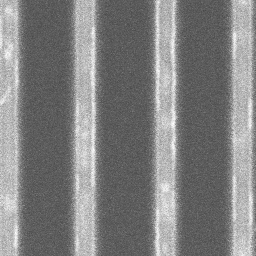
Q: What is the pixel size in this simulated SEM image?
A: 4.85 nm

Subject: one or a few lines or trenches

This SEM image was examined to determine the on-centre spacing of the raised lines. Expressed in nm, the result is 381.